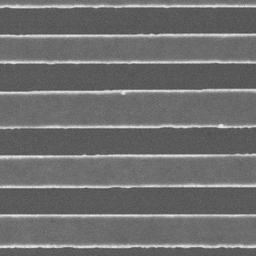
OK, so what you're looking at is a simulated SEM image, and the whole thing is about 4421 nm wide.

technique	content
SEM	lines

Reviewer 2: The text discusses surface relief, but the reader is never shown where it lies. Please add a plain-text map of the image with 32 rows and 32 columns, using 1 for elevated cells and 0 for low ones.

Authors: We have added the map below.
11111111111111111111111111111111
00000000000000000000000000000000
00000000000000000000000000000000
00000000000000000000000000000000
11011111111111111111111111111111
11111111111111111111111111111111
11111111111111111111111111111111
11111111111111111111111111111111
00000000000000000000000000000000
00000000000000000000000000000000
00000000000000000000000000000000
00001111111111111111111111111111
11111111111111111111111111111111
11111111111111111111111111111111
11111111111111111111111111111111
11111111111111111111111111111111
00000000000000000000000000000000
00000000000000000000000000000000
00000000000000000000000000000000
00000000000011111111111111111111
11111111111111111111111111111111
11111111111111111111111111111111
11111111111111111111111111111111
00000000000000000000000000000000
00000000000000000000000000000000
00000000000000000000000000000000
00000000000000000000000000000000
11111111111111111111111111111111
11111111111111111111111111111111
11111111111111111111111111111111
11111111111111111111111111111111
00000000000000000000000000000000